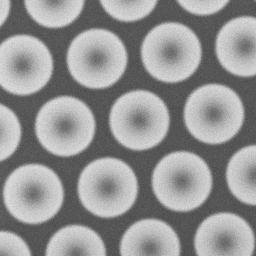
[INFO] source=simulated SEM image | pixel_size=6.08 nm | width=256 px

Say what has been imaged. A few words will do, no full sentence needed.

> an array of small figures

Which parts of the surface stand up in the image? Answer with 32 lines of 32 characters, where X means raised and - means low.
X--XXXXXXX---XXXXXX----XXXXX----
X---XXXXXX---XXXXXX-----XXX-----
X---XXXXX------XX------------XXX
-------------------XXXX-----XXXX
--X-------XXXX----XXXXXX---XXXXX
XXXXX----XXXXXX---XXXXXXX--XXXXX
XXXXXX---XXXXXXX--XXXXXXX--XXXXX
XXXXXX--XXXXXXXX--XXXXXXX--XXXXX
XXXXXX---XXXXXXX--XXXXXXX---XXXX
XXXXXX---XXXXXX----XXXXX--------
XXXXXX----XXXX------------------
-XXX------------XX------XXXXX---
-------XXX-----XXXXX---XXXXXXX--
X----XXXXXX---XXXXXXX--XXXXXXX--
XX---XXXXXXX--XXXXXXX--XXXXXXX--
XX---XXXXXXX--XXXXXXX--XXXXXXX--
XXX--XXXXXXX--XXXXXXX---XXXXXX--
XX---XXXXXX----XXXXX-----XXX----
XX----XXXXX-----XXX------------X
X--------------------XXXX----XXX
-----------XXXXX----XXXXXX---XXX
--XXXXX---XXXXXXX--XXXXXXX--XXXX
-XXXXXX---XXXXXXX--XXXXXXX--XXXX
-XXXXXXX--XXXXXXX--XXXXXXX---XXX
-XXXXXXX--XXXXXXX---XXXXXX---XXX
-XXXXXXX--XXXXXXX---XXXXX------X
-XXXXXX----XXXX-----------------
--XXXX------------X-------XXXX--
--------XXX-----XXXXX----XXXXXX-
XX-----XXXXX----XXXXXX--XXXXXXXX
XXX---XXXXXXX--XXXXXXX--XXXXXXXX
XXXX--XXXXXXX--XXXXXXX---XXXXXXX